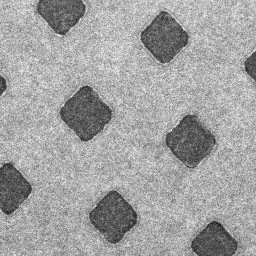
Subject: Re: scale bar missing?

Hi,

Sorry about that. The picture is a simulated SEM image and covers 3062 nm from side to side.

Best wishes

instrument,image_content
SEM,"holes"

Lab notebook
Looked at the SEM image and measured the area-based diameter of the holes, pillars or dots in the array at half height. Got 556 nm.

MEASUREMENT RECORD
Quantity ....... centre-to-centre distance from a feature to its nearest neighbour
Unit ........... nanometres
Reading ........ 1280